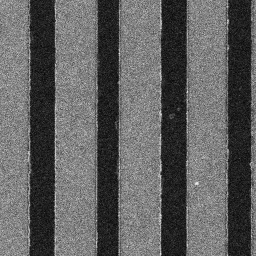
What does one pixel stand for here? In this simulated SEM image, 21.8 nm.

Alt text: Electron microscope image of one or a few lines or trenches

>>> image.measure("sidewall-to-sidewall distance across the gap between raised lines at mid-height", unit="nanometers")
884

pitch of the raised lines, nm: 1430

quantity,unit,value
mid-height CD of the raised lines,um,0.557